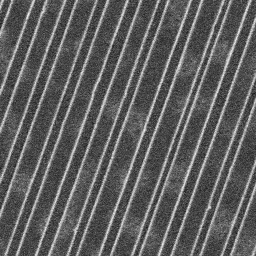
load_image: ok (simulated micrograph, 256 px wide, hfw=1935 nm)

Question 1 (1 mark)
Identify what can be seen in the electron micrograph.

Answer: parallel lines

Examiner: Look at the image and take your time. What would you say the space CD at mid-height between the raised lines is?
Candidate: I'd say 72.9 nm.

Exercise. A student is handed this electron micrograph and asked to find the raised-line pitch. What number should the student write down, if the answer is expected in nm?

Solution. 220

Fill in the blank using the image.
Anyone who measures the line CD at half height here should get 146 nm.